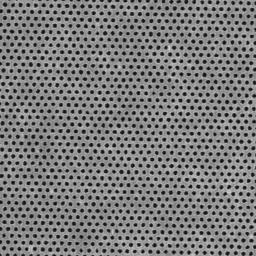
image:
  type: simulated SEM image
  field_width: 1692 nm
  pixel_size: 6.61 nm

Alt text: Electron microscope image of a regular array of holes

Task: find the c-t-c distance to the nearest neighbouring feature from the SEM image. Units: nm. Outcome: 47.2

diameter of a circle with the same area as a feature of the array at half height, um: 0.0269